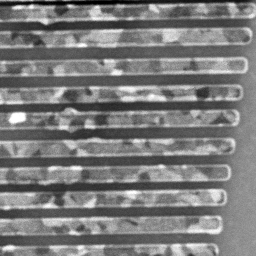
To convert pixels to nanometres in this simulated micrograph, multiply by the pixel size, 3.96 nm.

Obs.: parallel lines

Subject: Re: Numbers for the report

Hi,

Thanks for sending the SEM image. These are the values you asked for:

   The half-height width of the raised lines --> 0.0593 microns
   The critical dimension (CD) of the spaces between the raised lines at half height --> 45.5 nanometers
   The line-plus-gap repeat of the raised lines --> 106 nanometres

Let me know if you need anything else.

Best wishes